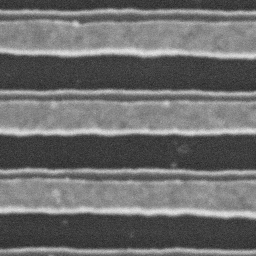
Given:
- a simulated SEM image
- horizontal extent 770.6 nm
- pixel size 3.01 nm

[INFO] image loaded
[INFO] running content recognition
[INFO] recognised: lines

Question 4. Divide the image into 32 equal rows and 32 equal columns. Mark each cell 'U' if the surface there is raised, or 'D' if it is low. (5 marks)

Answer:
DDDDDDDDDDDDDDDDDDDDDDDDDDDDDDDD
UUUUUDDDDDDUUUUUUUUUUUUUUUUDDDDD
UUUUUUUUUUUUUUUUUUUUUUUUUUUUUUUU
UUUUUUUUUUUUUUUUUUUUUUUUUUUUUUUU
UUUUUUUUUUUUUUUUUUUUUUUUUUUUUUUU
UUUUUUUUUUUUUUUUUUUUUUUUUUUUUUUU
DDDUUDDUUUUDDDDDDUUUDDDUUUUUUUUU
DDDDDDDDDDDDDDDDDDDDDDDDDDDDDDDD
DDDDDDDDDDDDDDDDDDDDDDDDDDDDDDDD
DDDDDDDDDDDDDDDDDDDDDDDDDDDDDDDD
DDDDDDDDDDDDDDDDDDDDDDDDDDDDDDDD
DDUDDDDUUUDUUUUUUUDDUUDUUDDDDDDD
UUUUUUUUUUUUUUUUUUUUUUUUUUUUUUUU
UUUUUUUUUUUUUUUUUUUUUUUUUUUUUUUU
UUUUUUUUUUUUUUUUUUUUUUUUUUUUUUUU
UUUUUUUUUUUUUUUUUUUUUUUUUUUUUUUU
DDDDDDDUUDDDDDDDDDDDDDDUUDDDDDDD
DDDDDDDDDDDDDDDDDDDDDDDDDDDDDDDD
DDDDDDDDDDDDDDDDDDDDDDDDDDDDDDDD
DDDDDDDDDDDDDDDDDDDDDDDDDDDDDDDD
DDDDDDDDDDDDDDDDDDDDDDDDDDDDDDDD
UUUUUUUUUUUUUUUUUUUUUUUUDDDDDDDD
UUUUUUUUUUUUUUUUUUUUUUUUUUUUUUUU
UUUUUUUUUUUUUUUUUUUUUUUUUUUUUUUU
UUUUUUUUUUUUUUUUUUUUUUUUUUUUUUUU
UUUUUUUUUUUUUUUUUUUUUUUUUUUUUUUU
DDDDDDDDDDDDDDDDDDDDDDDDDUUUUUUU
DDDDDDDDDDDDDDDDDDDDDDDDDDDDDDDD
DDDDDDDDDDDDDDDDDDDDDDDDDDDDDDDD
DDDDDDDDDDDDDDDDDDDDDDDDDDDDDDDD
DDDDDDDDDDDDDDDDDDDDDDDDDDDDDDDD
UUUUUUUUUUUUUUUUUUUUUUUUUUUUUUUU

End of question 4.